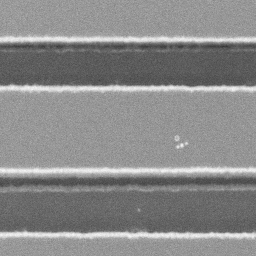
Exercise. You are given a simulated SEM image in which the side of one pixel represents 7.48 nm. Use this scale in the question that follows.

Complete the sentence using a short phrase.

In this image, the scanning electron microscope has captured lines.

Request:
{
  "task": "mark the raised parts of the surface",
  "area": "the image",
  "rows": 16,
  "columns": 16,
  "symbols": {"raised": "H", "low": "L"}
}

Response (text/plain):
HHHHHHHHHHHHHHHH
HHHHHHHHHHHHHHHH
HHHHHHHHHHHHHHHH
LLLLLLLLLLLLLLLL
LLLLLLLLLLLLLLLL
HHHHHHHHHHHHHHHH
HHHHHHHHHHHHHHHH
HHHHHHHHHHHHHHHH
HHHHHHHHHHHHHHHH
HHHHHHHHHHHHHHHH
HHHHHHHHHHHHHHHH
LLLLLLLLLLLLLLLL
LLLLLLLLLLLLLLLL
LLLLLLLLLLLLLLLL
LLLLLLLLLLLLLLLL
HHHHHHHHHHHHHHHH